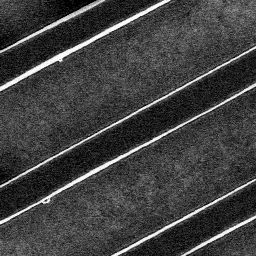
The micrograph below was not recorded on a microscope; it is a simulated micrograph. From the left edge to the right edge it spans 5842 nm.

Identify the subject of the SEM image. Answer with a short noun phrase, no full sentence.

lines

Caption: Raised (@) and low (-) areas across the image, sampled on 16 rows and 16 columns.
-----@@@@@------
---@@@@@--------
-@@@@@----------
@@@@-----------@
@@-----------@@@
-----------@@@@@
---------@@@@@--
--------@@@@----
------@@@@------
----@@@@--------
--@@@@----------
@@@@-----------@
@@@-----------@@
@-----------@@@@
----------@@@@--
--------@@@@----